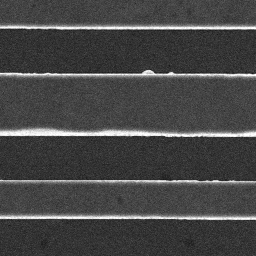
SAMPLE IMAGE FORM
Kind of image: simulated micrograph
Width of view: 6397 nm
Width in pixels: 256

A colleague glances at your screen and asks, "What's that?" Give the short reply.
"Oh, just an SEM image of lines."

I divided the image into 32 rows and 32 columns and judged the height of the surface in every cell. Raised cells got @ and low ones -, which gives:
@@@@@@@@@@@@@@@@@@@@@@@@@@@@@@@@
@@@@@@@@@@@@@@@@@@@@@@@@@@@@@@@@
@@@@@@@@@@@@@@@@@@@@@@@@@@@@@@@@
--------------------------------
--------------------------------
--------------------------------
--------------------------------
--------------------------------
--------------------------------
@@@@@@@@@@@@@@@@@@@@@@@@@@@@@@@@
@@@@@@@@@@@@@@@@@@@@@@@@@@@@@@@@
@@@@@@@@@@@@@@@@@@@@@@@@@@@@@@@@
@@@@@@@@@@@@@@@@@@@@@@@@@@@@@@@@
@@@@@@@@@@@@@@@@@@@@@@@@@@@@@@@@
@@@@@@@@@@@@@@@@@@@@@@@@@@@@@@@@
@@@@@@@@@@@@@@@@@@@@@@@@@@@@@@@@
@@@@@@@@@@@@@@@@@@@@@@@@@@@@@@@@
--------------------------------
--------------------------------
--------------------------------
--------------------------------
--------------------------------
--------------------------------
@@@@@@@@@@@@@@@@@@@@@@@@@@@@@@@@
@@@@@@@@@@@@@@@@@@@@@@@@@@@@@@@@
@@@@@@@@@@@@@@@@@@@@@@@@@@@@@@@@
@@@@@@@@@@@@@@@@@@@@@@@@@@@@@@@@
--------------------------------
--------------------------------
--------------------------------
--------------------------------
--------------------------------